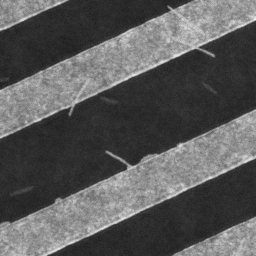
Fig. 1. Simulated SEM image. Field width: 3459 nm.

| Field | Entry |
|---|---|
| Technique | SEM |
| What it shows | lines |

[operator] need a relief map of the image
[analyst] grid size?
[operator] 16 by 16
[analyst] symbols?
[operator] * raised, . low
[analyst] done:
***........*****
*........******.
.......******...
.....******.....
...******.......
*******.........
*****...........
**.............*
............****
..........******
........*******.
......******....
....******......
..******........
******........**
****........****